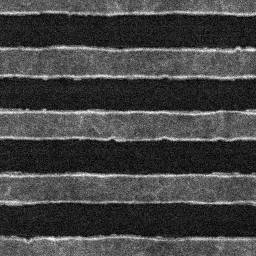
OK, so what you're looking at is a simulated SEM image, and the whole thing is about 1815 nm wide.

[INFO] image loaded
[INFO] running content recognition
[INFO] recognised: parallel lines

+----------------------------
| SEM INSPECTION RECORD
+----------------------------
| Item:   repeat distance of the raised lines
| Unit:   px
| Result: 62.9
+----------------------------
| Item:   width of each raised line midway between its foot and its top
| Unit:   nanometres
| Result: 187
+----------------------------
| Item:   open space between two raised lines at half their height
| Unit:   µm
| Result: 0.26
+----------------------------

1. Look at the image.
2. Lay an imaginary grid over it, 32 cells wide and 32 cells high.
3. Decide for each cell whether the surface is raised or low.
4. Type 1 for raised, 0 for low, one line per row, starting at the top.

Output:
11111111111111111111111111111111
11111100111111111111111111111111
00000000000000000000000000000000
00000000000000000000000000000000
00000000000000000000000000000000
00000000000000000000000000000000
11111111111111111111111111111111
11111111111111111111111111111111
11111111111111111111111111111111
00001110011101110011011111111111
00000000000000000000000000000000
00000000000000000000000000000000
00000000000000000000000000000000
00000000000000000000000000000000
11111111111111111111111111111111
11111111111111111111111111111111
11111111111111111111111111111111
00000000000000000000000000000000
00000000000000000000000000000000
00000000000000000000000000000000
00000000000000000000000000000000
00000000000000000000000000000000
11111111111111111111111111111111
11111111111111111111111111111111
11111111111111111111111111111111
00000000000000000000000000000000
00000000000000000000000000000000
00000000000000000000000000000000
00000000000000000000000000000000
00000000000000000000000000000000
11111111111111111111111111111111
11111111111111111111111111111111